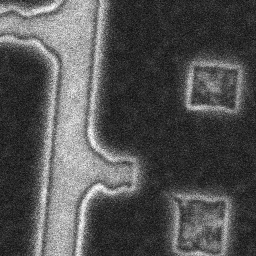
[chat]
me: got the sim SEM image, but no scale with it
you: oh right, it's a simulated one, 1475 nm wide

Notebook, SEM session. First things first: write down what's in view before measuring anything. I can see one or a few lines or trenches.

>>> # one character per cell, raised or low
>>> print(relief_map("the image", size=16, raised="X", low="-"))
XXX---XXXXXXXXXX
------XXXXXXXXXX
X-----XXXXXXXXXX
XXX---XXXXXXXXXX
XXXX--XXXXXX---X
XXX---XXXXXX---X
XXX---XXXXXX---X
XXX---XXXXXXXXXX
XXX---XXXXXXXXXX
XXX---XXXXXXXXXX
XXX-----XXXXXXXX
XXX-----XXXXXXXX
XXX--XXXXXX---XX
XXX--XXXXXX---XX
XXX--XXXXXX---XX
XX---XXXXXX---XX